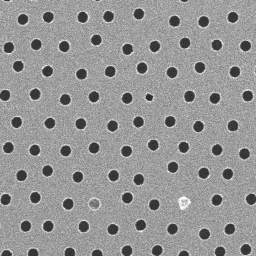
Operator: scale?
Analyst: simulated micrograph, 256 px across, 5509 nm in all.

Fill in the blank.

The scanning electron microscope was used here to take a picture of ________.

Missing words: a regular array of holes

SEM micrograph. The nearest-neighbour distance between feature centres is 564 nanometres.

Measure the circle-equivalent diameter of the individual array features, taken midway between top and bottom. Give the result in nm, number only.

240